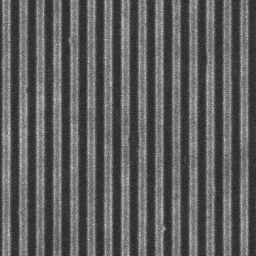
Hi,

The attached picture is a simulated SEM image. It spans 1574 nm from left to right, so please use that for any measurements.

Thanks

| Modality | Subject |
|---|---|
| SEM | parallel lines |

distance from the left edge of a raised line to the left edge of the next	0.105	microns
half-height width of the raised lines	49.2	nm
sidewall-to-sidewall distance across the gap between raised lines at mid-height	53.8	nanometers